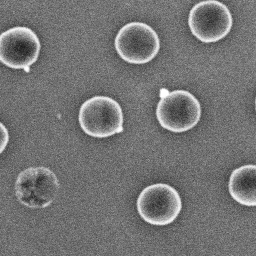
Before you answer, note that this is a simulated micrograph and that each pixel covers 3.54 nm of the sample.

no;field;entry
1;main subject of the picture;raised bodies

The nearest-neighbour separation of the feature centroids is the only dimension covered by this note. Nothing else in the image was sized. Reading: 273 nm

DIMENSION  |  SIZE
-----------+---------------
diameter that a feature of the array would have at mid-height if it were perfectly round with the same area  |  145 nanometres